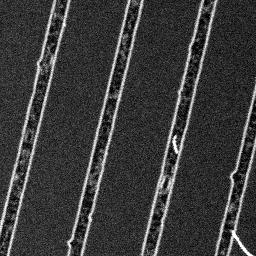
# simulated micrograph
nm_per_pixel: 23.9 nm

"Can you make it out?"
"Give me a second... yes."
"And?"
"one or a few lines or trenches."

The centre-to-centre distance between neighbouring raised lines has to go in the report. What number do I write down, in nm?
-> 1710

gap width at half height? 1390 nanometers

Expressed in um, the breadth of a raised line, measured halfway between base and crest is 0.325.